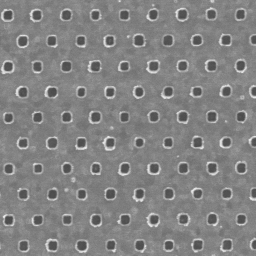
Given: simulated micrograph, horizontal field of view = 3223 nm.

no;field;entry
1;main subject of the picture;a regular array of holes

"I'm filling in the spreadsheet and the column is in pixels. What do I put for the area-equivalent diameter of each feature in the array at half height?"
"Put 10.3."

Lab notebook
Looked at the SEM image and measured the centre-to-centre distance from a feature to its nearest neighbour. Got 28.8 pixels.